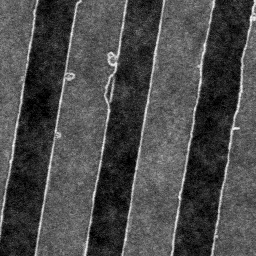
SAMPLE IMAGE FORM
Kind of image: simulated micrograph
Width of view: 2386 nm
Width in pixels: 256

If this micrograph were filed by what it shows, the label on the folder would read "one or a few lines or trenches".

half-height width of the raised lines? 368 nm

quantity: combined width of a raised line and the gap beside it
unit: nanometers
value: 812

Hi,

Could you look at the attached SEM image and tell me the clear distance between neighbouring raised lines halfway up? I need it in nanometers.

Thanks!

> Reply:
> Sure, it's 448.